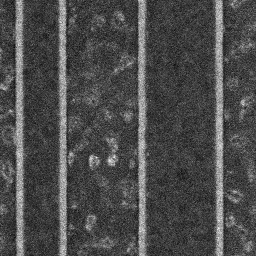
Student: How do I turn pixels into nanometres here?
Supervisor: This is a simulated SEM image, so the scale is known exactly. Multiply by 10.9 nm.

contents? one or a few lines or trenches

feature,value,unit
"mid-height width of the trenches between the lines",862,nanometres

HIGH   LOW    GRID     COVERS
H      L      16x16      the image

LHHHLLLLLHHHHHLL
LHHHLLLLLHHHHHLL
LHHHLLLLLHHHHHLL
LHHHLLLLLHHHHHLL
LHHHLLLLLHHHHHLL
LHHHLLLLLHHHHHLL
LHHHLLLLLHHHHHLL
LHHHLLLLLHHHHHLL
LHHHLLLLLHHHHHLL
LHHHLLLLLHHHHHLL
LHHHLLLLLHHHHHLL
LHHHLLLLLHHHHHLL
LHHHLLLLLHHHHHLL
LHHHLLLLLHHHHHLL
LHHHLLLLLHHHHHLL
LHHHLLLLLHHHHHLL